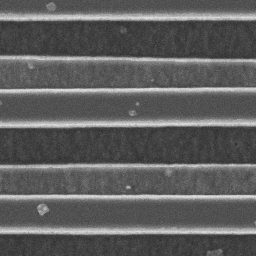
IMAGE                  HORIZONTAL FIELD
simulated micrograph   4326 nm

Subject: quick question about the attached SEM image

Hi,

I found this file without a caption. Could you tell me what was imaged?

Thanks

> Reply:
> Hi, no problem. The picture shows lines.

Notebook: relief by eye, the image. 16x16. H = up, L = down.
HHHHHHHHHHHHHHHH
LLLLLLLLLLLLLLLL
LLLLLLLLLLLLLLLL
LLLLLLLLLLLLLLLL
HHHHHHHHHHHHHHHH
HHHHHHHHHHHHHHHH
HHHHHHHHHHHHHHHH
HHHHHHHHHHHHHHHH
LLLLLLLLLLLLLLLL
LLLLLLLLLLLLLLLL
HHHHHHHHHHHHHHHH
HHHHHHHHHHHHHHHH
HHHHHHHHHHHHHHHH
HHHHHHHHHHHHHHHH
LLLLLLLLLLHHHHHH
LLLLLLLLLLLLLLLL